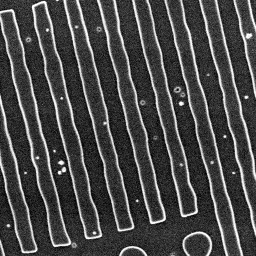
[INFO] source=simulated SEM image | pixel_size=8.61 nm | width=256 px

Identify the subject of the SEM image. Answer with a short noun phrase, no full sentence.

groups of lines, slits or small figures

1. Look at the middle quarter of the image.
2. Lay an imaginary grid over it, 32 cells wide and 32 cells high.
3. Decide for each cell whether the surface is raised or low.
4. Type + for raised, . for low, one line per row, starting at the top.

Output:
....++++....++++.....++++....+++
....++++.....+++.....++++.....++
....++++.....++++....++++.....++
....+++++....++++.....++++....++
.....++++....++++.....++++....++
.....++++....++++.....++++.....+
+....++++.....++++.....+++.....+
+....+++++....++++.....+++.....+
+....+++++....++++.....++++....+
+.....++++....++++.....++++....+
++....++++.....++++....++++.....
++....+++++....++++....++++.....
++.....++++....++++.....++++....
++.....++++....++++.....++++....
++.....++++.....++++....++++....
+++....++++.....++++.....+++....
+++....++++.....++++.....+++....
+++.....++++....+++++....+++....
++++....++++.....++++....++++...
++++....++++.....++++....++++...
++++....+++++....++++.....++++..
+++++....++++....++++.....++++..
.++++....++++.....+++.....++++..
.++++....++++.....++++.....+++..
.++++.....+++.....++++.....+++..
.++++.....++++....++++.....++++.
..+++.....++++.....++++....++++.
..++++....++++.....++++....++++.
..++++....+++++....++++....++++.
..++++.....++++....++++.....+++.
..++++.....++++....++++.....++++
...+++.....++++.....++++....++++